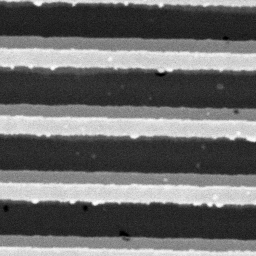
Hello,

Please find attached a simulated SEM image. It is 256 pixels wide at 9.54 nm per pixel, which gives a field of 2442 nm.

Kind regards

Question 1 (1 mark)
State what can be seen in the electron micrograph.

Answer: lines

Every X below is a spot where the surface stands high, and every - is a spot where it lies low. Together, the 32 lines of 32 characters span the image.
----X----------X--XXXXXXXXXXXXXX
--------------------------------
--------------------------------
--------------------------------
--------------------------------
XXXXXXXXXXXXXXXXXXXXXXXXXXXXXXXX
XXXXXXXXXXXXXXXXXXXXXXXXXXXXXXXX
XXXXXXXXXXXXXXXXXXXXXXXXXXXXXXXX
-----XX--XXX-XXXXXXXXXXXXXXXXXXX
--------------------------------
--------------------------------
--------------------------------
--------------------------------
XXXXXXXXXXXXXXXXXXXXXXX---------
XXXXXXXXXXXXXXXXXXXXXXXXXXXXXXXX
XXXXXXXXXXXXXXXXXXXXXXXXXXXXXXXX
XXXXXXXXXXXXXXXXXXXXXXXXXXXXXXXX
-------------------------------X
--------------------------------
--------------------------------
--------------------------------
XXXXX---------------------------
XXXXXXXXXXXXXXXXXXXXXXXXXXXXXXXX
XXXXXXXXXXXXXXXXXXXXXXXXXXXXXXXX
XXXXXXXXXXXXXXXXXXXXXXXXXXXXXXXX
------------------------X-XXXXXX
--------------------------------
--------------------------------
--------------------------------
XXX-X-X-------------------------
XXXXXXXXXXXXXXXXXXXXXXXXXXXXXXXX
XXXXXXXXXXXXXXXXXXXXXXXXXXXXXXXX